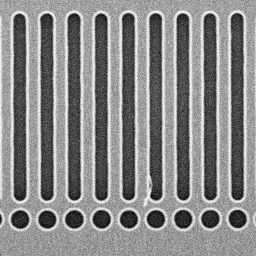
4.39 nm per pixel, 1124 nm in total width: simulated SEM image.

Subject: groups of lines, slits or small figures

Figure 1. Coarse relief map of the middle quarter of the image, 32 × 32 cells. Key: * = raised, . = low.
*....***...***....***....***....
*...****...***....***....***....
*...****...***....***....***....
*...***....***....***....***....
*...***....***....***....***....
*....**....***....***....***....
*....**....***....***....***....
*....**....***....***....***....
*...****...***....***....***....
*...****...***....***....***....
*...****...***....***....***....
*....***...***....***....***....
*....***...***....***....***....
*....***...***....***....***....
*....***...***....***....***....
*....***...***....***....***....
*...****...***....***....***....
*....***...***....***....***....
*....***...***....***....***....
*....***...***....***....***....
*....***...***....***....***....
*....***...***....***....***....
*....***...***....***....***....
*....***...***....***....***....
*....***...***....***....***....
*....***...***....***....***....
*....***...***....***....***....
*....***...***....***....***....
*....***...***....****...***....
*....***...***....***....***....
*....***...***....***....***....
*....***...***....***....***....